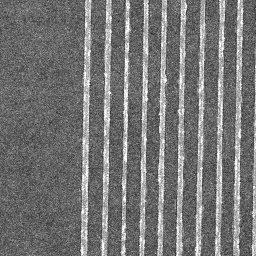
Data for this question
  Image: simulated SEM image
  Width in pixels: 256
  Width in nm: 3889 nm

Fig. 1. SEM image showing parallel lines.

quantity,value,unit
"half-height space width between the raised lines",218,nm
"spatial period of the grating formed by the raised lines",289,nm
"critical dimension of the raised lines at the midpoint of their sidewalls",74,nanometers